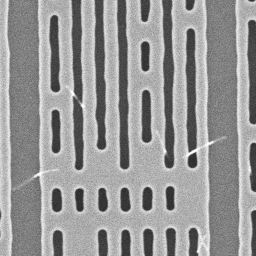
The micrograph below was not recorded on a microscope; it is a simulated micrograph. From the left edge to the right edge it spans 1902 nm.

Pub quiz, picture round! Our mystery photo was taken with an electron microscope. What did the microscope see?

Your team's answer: groups of lines, slits or small figures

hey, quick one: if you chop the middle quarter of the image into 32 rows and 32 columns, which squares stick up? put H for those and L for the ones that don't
HHLLLHHHLLHHHHLLHHHLLHHHHLLLHHLL
HHLLLHHHLLHHHHLLHHHHLHHHHLLLHHLL
HHLLLHHHLLHHHHLLHHHHHHHHHLLLHHLL
HHLLLHHHLLHHHLLLHHHHHHHHHLLLHHHL
HHLLLHHHLLHHHHLLHHHHHHHHHLLLHHHL
HHLLLHHHLLLHHHLLHHHHHHHHHLLHHHHL
HHLLLHHHLLLHHHLLHHHHLHHHHLLHHHHL
HHHLLHHHLLHHHHLLHHHLLHHHHLLHHHHL
HHLLLHHHLLHHHHLLHHHLLLHHHLLHHHHL
HHLLLHHHLLHHHHLLHHHLLLHHHLLHHHHL
HHLLHHHHLLLHHLLLHHHLLLHHHLLHHHHL
HHLLLHHHLLLHHHLLHHHLLLHHHLLHHHHL
HHLLLHHHLLHHHHLLHHHLLLHHHLLHHHHL
HHLLLHHHLLHHHHLLHHHLLLHHHLLHHHHL
HHLLLHHHLLHHHHLLHHHLLLHHHLLHHHHL
HHLLLHHHLLHHHHLLHHHLLLHHHLLLHHHL
HHLLLHHHLLLHHHLLHHHLLLHHHLLLHHHL
HHLLLHHHLLHHHHLLHHHLLLHHHLLLHHHL
HHLLLHHHLLHHHHLLHHHLLLHHHLLLHHHL
HHLLLHHHLLLHHHLLHHHHLHHHHLLLHHHL
HHHLLHHHLLLHHHLLHHHHHHHHHLLLHHHL
HHHLLHHHHLHHHHLLHHHHHHHHHLLLHHHL
HHHLLHHHHHHHHHLLHHHHHHHHHHLLHHHH
HHHLLHHHHHHHHHLLHHHHHHHHHLLLHHHL
HHHLLHHHHHHHHHLLHHHHHHHHHLLLHHHL
HHHLLHHHHHHHHHLLHHHHHHHHHLLHHHHL
HHHLHHHHHHHHHHHHHHHHHHHHHHHHHHHH
HHHHHHHHHHHHHHHHHHHHHHHHHHHHHHHH
HHHHHHHHHHHHHHHHHHHHHHHHHHHHHHHH
HHHHHHHHHHHHHHHHHHHHHHHHHHHHHHHH
HHHHHHHHHHHHHHHHHHHHHHHHHHLHHHHH
HHHLLHHHHLHHHHLLHHHHLLHHHHLLHHHH